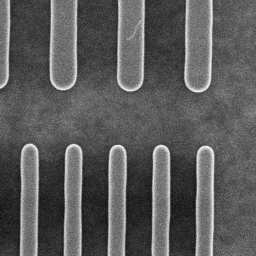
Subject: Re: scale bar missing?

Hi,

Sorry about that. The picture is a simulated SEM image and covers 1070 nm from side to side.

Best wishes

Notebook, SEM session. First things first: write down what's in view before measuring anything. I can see groups of lines, slits or small figures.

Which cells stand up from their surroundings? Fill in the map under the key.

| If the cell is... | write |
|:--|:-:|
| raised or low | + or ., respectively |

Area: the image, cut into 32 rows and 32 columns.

+.....++++.....+++.....++++.....
+.....++++.....+++.....++++.....
+.....++++.....+++.....++++.....
+.....++++.....+++.....++++.....
+.....++++.....+++.....+++......
+.....++++.....+++.....+++......
+.....++++.....+++.....+++......
+.....++++.....+++.....+++......
+.....++++.....+++.....+++......
+.....++++.....+++.....+++......
+......++......+++.....+++......
................................
................................
................................
................................
................................
................................
................................
...++...++....+.....+....+......
...++...++....++...++....++.....
...++...++....++...++....++.....
...++...++....++...++....++.....
...++...++....++...++....++.....
...++...++....++...++....++.....
...++...++....++...++....++.....
...++...++....++...++....++.....
...++...++....++...++....++.....
...++...++....++...++....++.....
...++...++....++...++....++.....
...++...++....++...++....++.....
...++...++....++...++....++.....
...++...++....++...++...+++.....